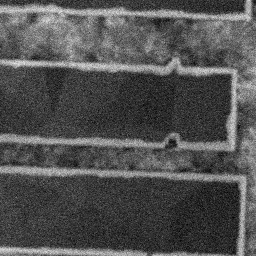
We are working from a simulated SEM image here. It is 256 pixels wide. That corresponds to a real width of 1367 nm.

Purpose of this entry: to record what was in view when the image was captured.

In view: one or a few lines or trenches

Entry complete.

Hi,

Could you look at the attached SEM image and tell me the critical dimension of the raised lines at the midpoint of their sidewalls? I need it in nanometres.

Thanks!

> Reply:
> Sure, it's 416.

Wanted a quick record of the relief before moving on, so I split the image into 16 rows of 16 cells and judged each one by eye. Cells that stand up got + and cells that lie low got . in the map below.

++++++++++++++++
................
................
................
++++++++++++++..
+++++++++++++++.
+++++++++++++++.
+++++++++++++++.
+++++++++++++++.
................
................
+++++++++++++++.
+++++++++++++++.
+++++++++++++++.
+++++++++++++++.
+++++++++++++++.